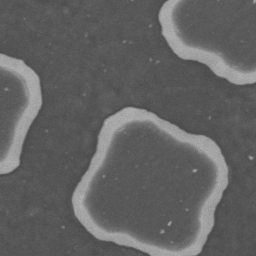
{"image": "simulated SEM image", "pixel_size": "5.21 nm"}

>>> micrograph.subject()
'raised bodies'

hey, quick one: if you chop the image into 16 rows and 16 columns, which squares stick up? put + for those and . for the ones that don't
..........++++++
..........++++++
...........+++++
............++++
++............++
++..............
++..............
++.....+++......
+......+++++....
+.....+++++++...
......++++++++..
.....+++++++++..
.....++++++++...
.....++++++++...
......+++++++...
.........+++....